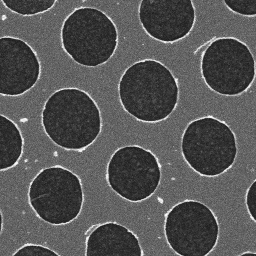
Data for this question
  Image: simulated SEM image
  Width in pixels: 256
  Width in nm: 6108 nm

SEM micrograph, holes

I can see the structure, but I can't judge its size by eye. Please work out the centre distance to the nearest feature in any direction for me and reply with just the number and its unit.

1.9 µm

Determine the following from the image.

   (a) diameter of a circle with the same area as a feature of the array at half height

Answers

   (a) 1330 nm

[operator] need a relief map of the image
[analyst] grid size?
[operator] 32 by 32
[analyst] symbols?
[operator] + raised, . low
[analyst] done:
+......+++++++++++......++++....
++...++++....++++.......++++++..
++++++++......++++......++++++++
++++++++......++++......++++++++
++++++++.......++++....+++++++++
...+++++.......+++++++++++....++
....++++......++++++++++++.....+
.....++++....++++++++++++.......
.....+++++++++++.....++++.......
.....++++++++++.......+++.......
....+++++++++++.......++++.....+
...++++...+++++.......+++++...++
++++++.....++++.......++++++++++
++++++......++++......++++++++++
+++++.......+++++....+++++++++++
..+++........+++++++++++....++++
..++++......+++++++++++......+++
...++++.....+++++++++++......+++
...+++++..+++++..++++++......+++
..++++++++++++.....++++......+++
..++++++++++++......++++.....+++
+++++....+++++......+++++...++++
++++......++++......++++++++++++
++++......++++......+++++++++++.
++++......+++++....++++++++++++.
++++......+++++++++++++..++++++.
+++++.....+++++++++++.....+++++.
++++++...++++++++++++......+++++
++++++++++++....+++++......+++++
+++++++++++......++++......+++++
+++++++++++......++++......+++++
++.....++++.......++++....++++++